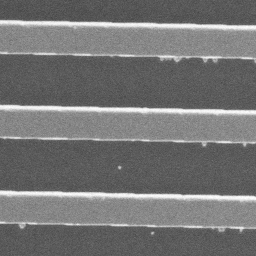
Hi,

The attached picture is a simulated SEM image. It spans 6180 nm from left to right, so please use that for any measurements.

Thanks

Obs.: lines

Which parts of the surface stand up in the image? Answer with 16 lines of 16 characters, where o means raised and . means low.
................
oooooooooo......
oooooooooooooooo
..........oooooo
................
................
................
oooooooooooooooo
oooooooooooooooo
................
................
................
oooooooooooooooo
oooooooooooooooo
................
................